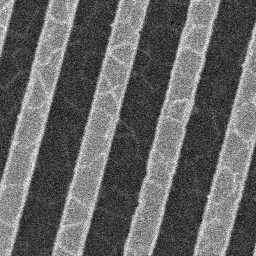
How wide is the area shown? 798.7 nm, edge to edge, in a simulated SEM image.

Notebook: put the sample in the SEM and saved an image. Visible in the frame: one or a few lines or trenches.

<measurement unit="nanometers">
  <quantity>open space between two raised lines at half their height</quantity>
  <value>134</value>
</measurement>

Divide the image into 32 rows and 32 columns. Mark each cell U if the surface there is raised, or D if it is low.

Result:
UUDDDDUUUDDDDDDUUUDDDDDDUUUDDDDD
UDDDDDUUUDDDDDDUUUDDDDDDUUUDDDDD
UDDDDDUUUDDDDDDUUUDDDDDUUUUDDDDD
UDDDDDUUUDDDDDUUUUDDDDDUUUDDDDDD
DDDDDUUUDDDDDDUUUDDDDDDUUUDDDDDD
DDDDDUUUDDDDDDUUUDDDDDDUUUDDDDDU
DDDDDUUUDDDDDUUUUDDDDDUUUUDDDDDU
DDDDUUUUDDDDDUUUUDDDDDUUUDDDDDDU
DDDDUUUDDDDDDUUUDDDDDDUUUDDDDDDU
DDDDUUUDDDDDDUUUDDDDDUUUUDDDDDUU
DDDDUUUDDDDDUUUUDDDDDUUUUDDDDDUU
DDDUUUUDDDDDUUUDDDDDDUUUDDDDDDUU
DDDUUUDDDDDDUUUDDDDDDUUUDDDDDDUU
DDDUUUDDDDDDUUUDDDDDUUUUDDDDDUUU
DDDUUUDDDDDUUUUDDDDDUUUDDDDDDUUU
DDUUUDDDDDDUUUDDDDDDUUUDDDDDDUUU
DDUUUDDDDDDUUUDDDDDDUUUDDDDDUUUU
DDUUUDDDDDUUUUDDDDDUUUUDDDDDUUUU
DDUUUDDDDDUUUUDDDDDUUUDDDDDDUUUU
DUUUDDDDDDUUUDDDDDDUUUDDDDDDUUUD
DUUUDDDDDDUUUDDDDDDUUUDDDDDUUUUD
DUUUDDDDDDUUUDDDDDDUUUDDDDDUUUUD
UUUUDDDDDUUUUDDDDDUUUDDDDDDUUUDD
UUUDDDDDDUUUDDDDDDUUUDDDDDDUUUDD
UUUDDDDDDUUUDDDDDDUUUDDDDDUUUUDD
UUUDDDDDUUUUDDDDDUUUDDDDDDUUUUDD
UUUDDDDDUUUDDDDDDUUUDDDDDDUUUDDD
UUDDDDDDUUUDDDDDDUUUDDDDDDUUUDDD
UUDDDDDDUUUDDDDDUUUUDDDDDUUUUDDD
UUDDDDDUUUUDDDDDUUUUDDDDDUUUDDDD
UUDDDDDUUUDDDDDDUUUDDDDDDUUUDDDD
UDDDDDDUUUDDDDDDUUUDDDDDUUUUDDDD